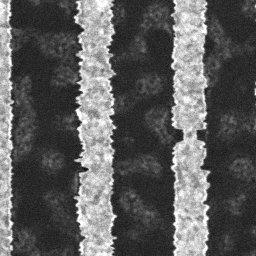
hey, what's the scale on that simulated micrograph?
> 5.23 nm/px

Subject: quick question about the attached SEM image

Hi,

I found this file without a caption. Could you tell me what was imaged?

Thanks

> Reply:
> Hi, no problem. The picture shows one or a few lines or trenches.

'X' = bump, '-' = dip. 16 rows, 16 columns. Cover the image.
X----XX----XX---
X----XX----XX---
X----XX----XX---
X----XX----XX---
X----XX----XX---
X----XX----XX---
X----XX----XX---
X----XX----XX---
X----XX----X----
X----XX----XX---
X----XX----XX---
X----XX----XX---
X----XX----XX---
X----XX----XX---
X----XX----XX---
X----XX----XX---